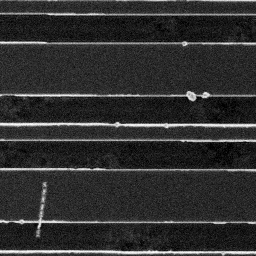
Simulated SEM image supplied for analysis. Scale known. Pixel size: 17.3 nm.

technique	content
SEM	lines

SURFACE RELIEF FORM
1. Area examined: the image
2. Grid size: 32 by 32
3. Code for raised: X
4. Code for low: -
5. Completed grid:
XXXXXXXXXXXXXXXXXXXXXXXXXXXXXXXX
XXXXXXXXXXXXXXXXXXXXXXXXXXXXXXXX
--------------------------------
--------------------------------
--------------------------------
XXXXXXXXXXXXXXXXXXXXXXXXXXXXXXXX
XXXXXXXXXXXXXXXXXXXXXXXXXXXXXXXX
XXXXXXXXXXXXXXXXXXXXXXXXXXXXXXXX
XXXXXXXXXXXXXXXXXXXXXXXXXXXXXXXX
XXXXXXXXXXXXXXXXXXXXXXXXXXXXXXXX
XXXXXXXXXXXXXXXXXXXXXXXXXXXXXXXX
XXXXXXXXXXXXXXXXXXXXXXXXXXXXXXXX
--------------------------------
--------------------------------
--------------------------------
--------------X-----------------
XXXXXXXXXXXXXXXXXXXXXXXXXXXXXXXX
XXXXXXXXXXXXXXXXXXXXXXXXXXXXXXXX
--------------------------------
--------------------------------
--------------------------------
XXXXXXXXXXXXXXXXXXXXXXXXXXXXXXXX
XXXXXXXXXXXXXXXXXXXXXXXXXXXXXXXX
XXXXXXXXXXXXXXXXXXXXXXXXXXXXXXXX
XXXXXXXXXXXXXXXXXXXXXXXXXXXXXXXX
XXXXXXXXXXXXXXXXXXXXXXXXXXXXXXXX
XXXXXXXXXXXXXXXXXXXXXXXXXXXXXXXX
XXXXXXXXXXXXXXXXXXXXXXXXXXXXXXXX
--------------------------------
--------------------------------
--------------------------------
--------------------------------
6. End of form